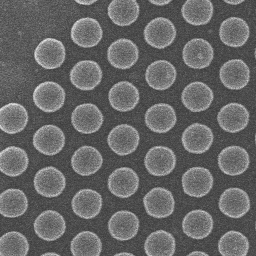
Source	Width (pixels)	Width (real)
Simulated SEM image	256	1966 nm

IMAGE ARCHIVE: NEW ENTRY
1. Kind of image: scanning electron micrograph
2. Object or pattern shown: a regular array of raised bodies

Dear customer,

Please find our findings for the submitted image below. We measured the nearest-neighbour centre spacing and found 323 nanometers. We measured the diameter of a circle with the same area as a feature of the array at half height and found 29.5 px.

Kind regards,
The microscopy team